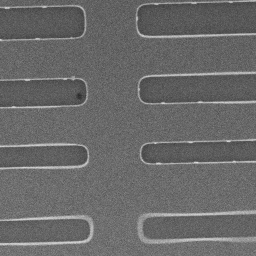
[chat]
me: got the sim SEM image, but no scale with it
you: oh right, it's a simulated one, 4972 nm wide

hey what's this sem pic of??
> groups of lines, slits or small figures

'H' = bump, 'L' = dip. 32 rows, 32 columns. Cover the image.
HHHHHHHHHHHHHHHHHHHLLLLLLLLLLLLL
LLLLLLLLLLHHHHHHHLLLLLLLLLLLLLLL
LLLLLLLLLLLHHHHHHLLLLLLLLLLLLLLL
LLLLLLLLLLLHHHHHHLLLLLLLLLLLLLLL
LLLLLLLLLLHHHHHHHHLLLLLLLHHHHHHH
HHHHHHHHHHHHHHHHHHHHHHHHHHHHHHHH
HHHHHHHHHHHHHHHHHHHHHHHHHHHHHHHH
HHHHHHHHHHHHHHHHHHHHHHHHHHHHHHHH
HHHHHHHHHHHHHHHHHHHHHHHHHHHHHHHH
HHHHHHHHHHHHHHHHHHHLLLLLLLLLLLLL
LLLLLLLLLLLHHHHHHLLLLLLLLLLLLLLL
LLLLLLLLLLLHHHHHHLLLLLLLLLLLLLLL
LLLLLLLLLLLHHHHHHHLLLLLLLLLLLLLL
HHHHHHHHHHHHHHHHHHHHHHHHHHHHHHHH
HHHHHHHHHHHHHHHHHHHHHHHHHHHHHHHH
HHHHHHHHHHHHHHHHHHHHHHHHHHHHHHHH
HHHHHHHHHHHHHHHHHHHHHHHHHHHHHHHH
HHHHHHHHHHHHHHHHHHHHHHHHHHHHHHLL
LLLLLLLLLLLHHHHHHHLLLLLLLLLLLLLL
LLLLLLLLLLLHHHHHHHLLLLLLLLLLLLLL
LLLLLLLLLLLHHHHHHHHLLLLHHHHHHHHH
HHHHHHHHHHHHHHHHHHHHHHHHHHHHHHHH
HHHHHHHHHHHHHHHHHHHHHHHHHHHHHHHH
HHHHHHHHHHHHHHHHHHHHHHHHHHHHHHHH
HHHHHHHHHHHHHHHHHHHHHHHHHHHHHHHH
HHHHHHHHHHHHHHHHHHHHHHHHHHHHHHHH
HHHHHHHHHHHHHHHHHHHHHHHHHHHHHHLL
HLLLLLLLLLLHHHHHHHLLLLLLLLLLLLLL
LLLLLLLLLLLHHHHHHLLLLLLLLLLLLLLL
LLLLLLLLLLLHHHHHHHLLLLLLLLLLLLLL
LLLLHHHHHHHHHHHHHHHHHHHHHHHHHHHH
HHHHHHHHHHHHHHHHHHHHHHHHHHHHHHHH